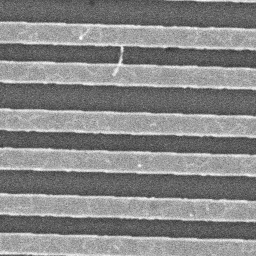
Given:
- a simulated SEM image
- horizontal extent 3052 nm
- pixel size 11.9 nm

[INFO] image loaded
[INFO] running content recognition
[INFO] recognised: lines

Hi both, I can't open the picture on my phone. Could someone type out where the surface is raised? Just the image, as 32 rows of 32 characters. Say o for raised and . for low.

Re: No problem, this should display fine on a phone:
................................
................................
................................
ooooooooooooooooooooooooo.......
oooooooooooooooooooooooooooooooo
......o.oooooooooooooooooooooooo
................................
................................
oooooooooooooooooooooooooooo....
oooooooooooooooooooooooooooooooo
..........oooooooooooooooooooooo
................................
................................
................................
ooooooooooooooooooooooooooo.....
oooooooooooooooooooooooooooooooo
.........ooooooooooooooooooooooo
................................
................................
oooooooooooooooooooooooooooooooo
oooooooooooooooooooooooooooooooo
.................ooooooooooooooo
................................
................................
oooooooooo......................
oooooooooooooooooooooooooooooooo
oooooooooooooooooooooooooooooooo
..........................oooooo
................................
oooooooooooo....................
oooooooooooooooooooooooooooooooo
oooooooooooooooooooooooooooooooo